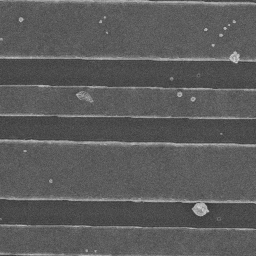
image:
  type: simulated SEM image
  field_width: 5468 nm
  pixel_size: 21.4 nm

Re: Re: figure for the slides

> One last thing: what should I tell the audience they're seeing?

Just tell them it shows lines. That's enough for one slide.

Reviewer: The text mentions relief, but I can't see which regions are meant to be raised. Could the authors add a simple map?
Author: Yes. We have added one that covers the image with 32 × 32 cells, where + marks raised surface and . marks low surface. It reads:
++++++++++++++++++++++++++++++++
++++++++++++++++++++++++++++++++
++++++++++++++++++++++++++++++++
++++++++++++++++++++++++++++++++
++++++++++++++++++++++++++++++++
++++++++++++++++++++++++++++++++
++++++++++++++++++++++++++++++++
.............................+++
................................
................................
................................
++++++++++++++++++++++++++++++++
++++++++++++++++++++++++++++++++
++++++++++++++++++++++++++++++++
..........++++++++++++++++++++++
................................
................................
................................
++++++++++++++++++++++++++++++++
++++++++++++++++++++++++++++++++
++++++++++++++++++++++++++++++++
++++++++++++++++++++++++++++++++
++++++++++++++++++++++++++++++++
++++++++++++++++++++++++++++++++
++++++++++++++++++++++++++++++++
........................++......
........................++......
................................
++++++++++++++++++..............
++++++++++++++++++++++++++++++++
++++++++++++++++++++++++++++++++
++++++++++++++++++++++++++++++++